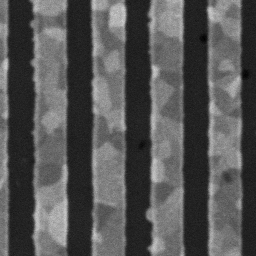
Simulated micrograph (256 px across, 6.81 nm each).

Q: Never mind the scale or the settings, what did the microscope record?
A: lines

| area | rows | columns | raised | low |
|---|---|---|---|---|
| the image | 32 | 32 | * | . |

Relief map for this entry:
*...****....****...****...****..
*...****....****...****...****..
*...****....****...****...****..
*...****....***....****...****..
*...****....****...****...****..
*...****....***....****...****..
*...****....***....****...****..
*...****....***....****...****..
*...****....***....****...****..
*...****....***....****...****..
*....***....***....****...****..
*....***....***....****...****..
*....***....***....****...****..
*...****....***....****...****..
*...****....***....****...****..
*...****....***....****...****..
*...****....****...****...****..
*...****....****...****...****..
*...****....****...****...****..
*...****....****...****...****..
*...****....***....****...****..
*...****....***....****...****..
*...****....***....****...****..
*...****....****...****...****..
*...****....****...****...****..
*....***....****...****...****..
*...****....***....****...****..
*...****....****...****...****..
*....***....***....****...****..
*...****....****...****...****..
*...****....****...****...****..
*....***....***....****...****..